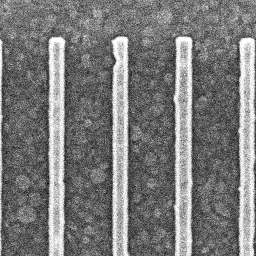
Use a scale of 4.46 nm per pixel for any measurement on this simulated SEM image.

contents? one or a few lines or trenches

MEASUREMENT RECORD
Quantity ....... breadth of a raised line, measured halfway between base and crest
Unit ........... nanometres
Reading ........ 51.6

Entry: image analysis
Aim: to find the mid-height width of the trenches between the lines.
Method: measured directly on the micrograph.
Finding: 231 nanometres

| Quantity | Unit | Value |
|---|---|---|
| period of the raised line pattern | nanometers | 283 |